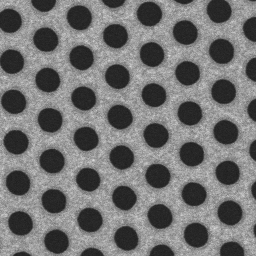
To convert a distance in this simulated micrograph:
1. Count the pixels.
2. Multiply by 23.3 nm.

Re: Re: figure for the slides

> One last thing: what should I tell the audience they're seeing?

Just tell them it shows a regular array of holes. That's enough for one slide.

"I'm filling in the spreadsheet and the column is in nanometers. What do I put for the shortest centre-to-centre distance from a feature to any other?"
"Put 935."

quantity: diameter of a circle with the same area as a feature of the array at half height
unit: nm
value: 584